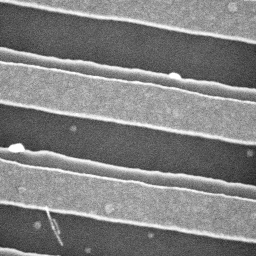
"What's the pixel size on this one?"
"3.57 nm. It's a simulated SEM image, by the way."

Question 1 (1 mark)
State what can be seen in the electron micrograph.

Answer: lines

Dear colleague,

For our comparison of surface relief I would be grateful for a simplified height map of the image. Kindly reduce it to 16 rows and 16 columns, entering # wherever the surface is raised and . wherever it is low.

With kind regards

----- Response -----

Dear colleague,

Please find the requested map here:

...#############
.........#######
...............#
###.............
#########.......
###############.
.###############
.......#########
.............###
###.............
########........
###############.
################
......##########
............####
................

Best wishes